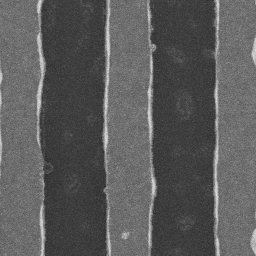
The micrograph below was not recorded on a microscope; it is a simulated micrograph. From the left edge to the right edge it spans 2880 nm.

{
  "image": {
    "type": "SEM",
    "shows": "one or a few lines or trenches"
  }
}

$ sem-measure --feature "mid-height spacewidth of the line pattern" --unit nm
754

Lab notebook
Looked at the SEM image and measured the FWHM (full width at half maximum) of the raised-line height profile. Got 0.477 microns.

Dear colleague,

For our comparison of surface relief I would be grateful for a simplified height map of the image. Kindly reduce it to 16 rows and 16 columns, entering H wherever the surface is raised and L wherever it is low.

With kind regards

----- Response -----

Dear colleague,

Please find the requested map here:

HHLLLLLHHLLLLLHH
HHLLLLLHHLLLLLHH
HHLLLLLHHLLLLLHH
HHHLLLLHHLLLLHHH
HHHLLLLHHLLLLLHH
HHHLLLLHHLLLLLHH
HHLLLLLHHLLLLLHH
HHLLLLLHHLLLLLHH
HHLLLLLHHLLLLLHH
HHHLLLLHHLLLLLHH
HHHLLLLHHLLLLLHH
HHHLLLLHHHLLLLHH
HHHLLLLHHHLLLLHH
HHHLLLLHHLLLLLHH
HHHLLLLHHLLLLLHH
HHHLLLLHHLLLLLHH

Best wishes